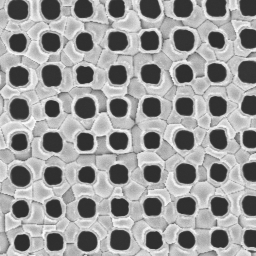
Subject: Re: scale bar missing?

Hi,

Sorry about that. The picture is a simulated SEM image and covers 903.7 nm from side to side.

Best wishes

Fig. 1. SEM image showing a regular array of holes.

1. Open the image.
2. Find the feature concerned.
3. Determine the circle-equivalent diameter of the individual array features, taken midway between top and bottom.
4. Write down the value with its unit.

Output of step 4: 0.0655 micrometres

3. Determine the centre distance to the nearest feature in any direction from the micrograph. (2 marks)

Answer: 115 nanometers